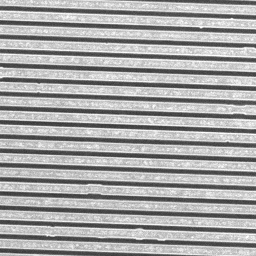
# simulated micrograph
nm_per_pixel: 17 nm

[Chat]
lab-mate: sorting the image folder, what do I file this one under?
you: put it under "parallel lines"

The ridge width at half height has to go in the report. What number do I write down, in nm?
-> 162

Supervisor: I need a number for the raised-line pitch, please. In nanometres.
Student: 242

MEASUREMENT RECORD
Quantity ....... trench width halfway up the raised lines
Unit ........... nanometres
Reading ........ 74.4